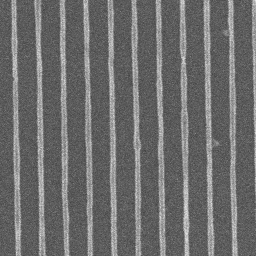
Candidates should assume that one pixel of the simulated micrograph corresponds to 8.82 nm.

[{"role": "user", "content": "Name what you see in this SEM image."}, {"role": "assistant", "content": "parallel lines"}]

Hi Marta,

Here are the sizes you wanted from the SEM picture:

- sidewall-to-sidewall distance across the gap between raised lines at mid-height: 0.177 microns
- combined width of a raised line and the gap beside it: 212 nm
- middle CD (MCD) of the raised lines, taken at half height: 30.9 nm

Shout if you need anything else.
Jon